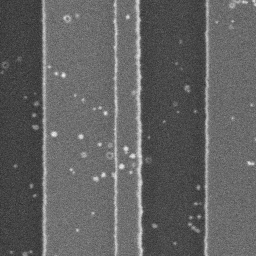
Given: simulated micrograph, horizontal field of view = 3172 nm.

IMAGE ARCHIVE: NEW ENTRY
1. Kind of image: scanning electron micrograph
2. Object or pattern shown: lines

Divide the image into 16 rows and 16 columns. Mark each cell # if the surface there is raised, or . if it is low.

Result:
...######....###
...######....###
...######....###
...######....###
...######....###
...######....###
...######....###
...######....###
...######....###
...######....###
...######....###
...######....###
...######....###
...######....###
...######....###
...######....###